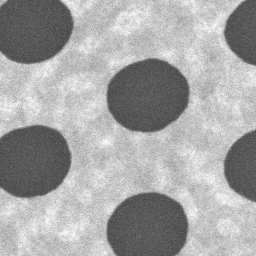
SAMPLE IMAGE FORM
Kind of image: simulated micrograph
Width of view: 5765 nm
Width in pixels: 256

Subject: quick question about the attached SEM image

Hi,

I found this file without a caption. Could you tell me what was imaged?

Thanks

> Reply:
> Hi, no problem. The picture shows holes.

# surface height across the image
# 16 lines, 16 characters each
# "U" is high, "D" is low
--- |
DDDDUUUUUUUUUUUD
DDDDDUUUUUUUUUDD
DDDDUUUUUUUUUUDD
DDDUUUUUUUUUUUUD
UUUUUUUDDDDUUUUU
UUUUUUUDDDDDUUUU
UUUUUUUDDDDDUUUU
UUUUUUUDDDDUUUUU
DDDDUUUUUUUUUUUD
DDDDUUUUUUUUUUDD
DDDDUUUUUUUUUUDD
DDDDUUUUUUUUUUDD
UUUUUUUUDDDUUUUU
UUUUUUUDDDDDUUUU
UUUUUUUDDDDDUUUU
UUUUUUUDDDDUUUUU